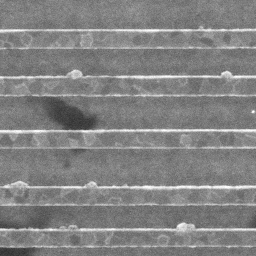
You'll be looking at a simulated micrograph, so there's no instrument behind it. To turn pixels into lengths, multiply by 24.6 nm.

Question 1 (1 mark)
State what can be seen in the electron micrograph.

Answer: lines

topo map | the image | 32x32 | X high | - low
--------------------------------
--------------------------------
--------------------------------
--------------------------------
XXXXXXXXXXXXXXXXXXXXXXXXXXXXXXXX
XXXXXXXXXXXXXXXXXXXXXXXXXXXXXXXX
--------------------------------
--------------------------------
--------------------------------
--------XXX----------------XX---
XXXXXXXXXXXXXXXXXXXXXXXXXXXXXXXX
XXXXXXXXXXXXXXXXXXXXXXXXXXXXXXXX
--------------------------------
--------------------------------
--------------------------------
--------------------------------
XXXXXXXXXXXXXXXXXXXXXXXXXXXXXXXX
XXXXXXXXXXXXXXXXXXXXXXXXXXXXXXXX
--------------------------------
--------------------------------
--------------------------------
--------------------------------
--------------------------------
XXXXXXXXXXXXXXXXXXXXXXXXXXXXXXXX
XXXXXXXXXXXXXXXXXXXXXXXXXXXXXXXX
XXXXXXXXXXXXXXXXXXXXXXXXXXXXXXXX
--------------------------------
--------------------------------
--------XX------------XX--------
XXXXXXXXXXXXXXXXXXXXXXXXXXXXXXXX
XXXXXXXXXXXXXXXXXXXXXXXXXXXXXXXX
--------------------------------